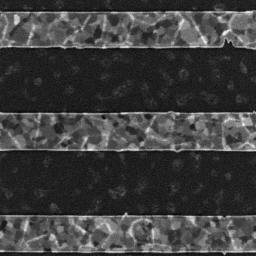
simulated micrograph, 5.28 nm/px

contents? one or a few lines or trenches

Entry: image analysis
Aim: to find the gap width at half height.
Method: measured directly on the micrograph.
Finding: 349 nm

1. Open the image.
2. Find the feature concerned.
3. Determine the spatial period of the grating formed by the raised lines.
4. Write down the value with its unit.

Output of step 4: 539 nanometres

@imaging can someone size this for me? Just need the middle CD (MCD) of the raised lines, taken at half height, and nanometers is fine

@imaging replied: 191